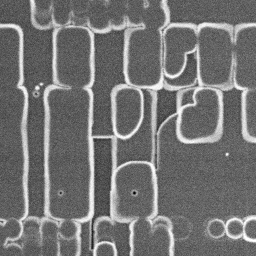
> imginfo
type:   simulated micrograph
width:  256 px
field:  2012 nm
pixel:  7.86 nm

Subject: wiring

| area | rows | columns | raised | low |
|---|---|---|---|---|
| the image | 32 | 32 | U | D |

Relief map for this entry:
DDDDUUUUUUUUUUUUUUUUUDDDDDDDDDDD
DDDDUUUUUUUUUUUUUUUUUDDDDDDDDDDD
DDDDUUUUUUUUUUUUUUUUUDDDDDDDDDDD
UUDDDDDUUUUUUUUDUUUUUUUUUUUUUDUU
UUUDDDDUUUUUDDDDUUUUUUUUUUUUUUUU
UUUDDDDUUUUUDDDDUUUUUUUUUUUUUUUU
UUUDDDDUUUUUDDDDUUUUUUUUUUUUUUUU
UUUDDDDUUUUUDDDDUUUUUUUDDUUUUUUU
UUUDDDDUUUUUDDDDUUUUUUUDDUUUUUUU
UUUDDDDUUUUUDDDDUUUUUUDDDUUUUUUU
UUUDDDDUUUUDDDDDUUUUDDDDDUUUUUUU
UUUDDDUUUUUDDDUUUUDDDDDDUUUUDDUU
UUUDDDUUUUUDDDUUUUDDDDDDUUUUDDUU
UUUDDDUUUUUDDDUUUUDDDDDUUUUUDDUU
UUUDDDUUUUUDDDUUUUDDDDUUUUUUDDUU
UUUDDDUUUUUDDDUUUUDDDDUUUUUUDDUU
UUUDDDUUUUUDDDUUUDDDDDUUUUUUDDDU
UUUDDDUUUUUDDDDDDDDDDDDUUUUDDDDU
UUUDDDUUUUUDDDDDDDDDDDDDDDDDDDDD
UUUDDDUUUUUDDDDDDDDDDDDDDDDDDDDD
UUUDDDUUUUUDDDDDUUUDDDDDDDDDDDDD
UUUDDDUUUUUDDDUUUUUDDDDDDDDDDDDD
UUUDDDUUUUUDDDUUUUUDDDDDDDDDDDDD
UUUDDDUUUUUDDDUUUUUDDDDDDDDDDDDD
UUUDDDUUUUUDDDUUUUUDDDDDDDDDDDDD
UUUDDDUUUUUDDDUUUUUDDDDDDDDDDDDD
UUUDDDUUUUUDDDUUUUUDDDDDDDDDDDDD
UUUUUUUUUUUDDDDUUUUUUDDDDDDDDUDU
UUUUUUUUUUDDDDDDUUUUUDDDDDDDUUUU
UUUUUUUUUUDDDDDDUUUUUDDDDDDDDUUU
UUUUUUUUUUDDUUDDUUUUUDDDDDDDDDDD
UUUUUUUUUUDDUUDDUUUUUDDDDDDDDDDD